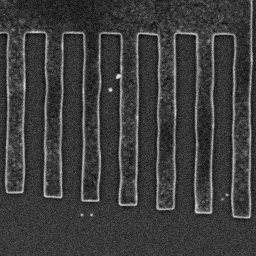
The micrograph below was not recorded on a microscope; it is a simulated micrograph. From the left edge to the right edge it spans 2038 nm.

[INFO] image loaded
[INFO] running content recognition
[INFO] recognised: groups of lines, slits or small figures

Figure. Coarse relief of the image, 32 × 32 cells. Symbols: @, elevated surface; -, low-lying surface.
@@@@@@@@@@@@@@@@@@@@@@@@@@@@@@@-
@@@@@@@@@@@@@@@@@@@@@@@@@@@@@@@-
@@@@@@@@@@@@@@@@@@@@@@@@@@@@@@@-
@@@@@@@@@@@@@@@@@@@@@@@@@@@@@@@-
-@@---@@--@@@--@@---@@--@@@--@@-
-@@---@@---@---@@---@@---@@--@@-
-@@---@@---@---@@---@@---@@--@@-
-@@---@@---@---@@---@@---@@--@@-
-@@---@@---@---@@---@@---@@--@@-
-@@---@@--@@@--@@---@@---@@--@@-
-@@---@@--@@@--@@---@@---@@--@@-
-@@---@@--@@---@@---@@---@@--@@-
-@@---@@--@@---@@---@@---@@--@@-
-@@---@@---@---@@---@@---@@--@@-
-@@---@@--@@---@@---@@---@@--@@-
-@@---@@--@@---@@---@@---@@--@@-
-@@---@@---@---@@---@@---@@--@@-
-@@---@@---@---@@---@@---@@--@@-
-@@---@@---@---@@---@@---@@--@@-
-@@---@@--@@---@@---@@---@---@@-
-@@---@@--@@---@@---@@---@---@@-
-@@---@@--@@---@@---@@--@@---@@-
-@@---@@--@@---@@---@@--@@---@@-
-@@---@@--@@---@@---@@--@@---@@-
------@---@@---@@---@@--@@---@@-
---------------@@---@@---@---@@-
-------------------------@---@@-
--------------------------------
--------------------------------
--------------------------------
--------------------------------
--------------------------------